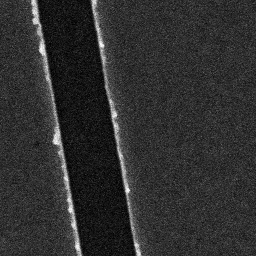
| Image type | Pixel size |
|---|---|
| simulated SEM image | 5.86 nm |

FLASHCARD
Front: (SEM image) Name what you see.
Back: one or a few lines or trenches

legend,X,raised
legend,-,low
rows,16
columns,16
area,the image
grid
XX----XXXXXXXXXX
XX----XXXXXXXXXX
XXX---XXXXXXXXXX
XXX---XXXXXXXXXX
XXX----XXXXXXXXX
XXX----XXXXXXXXX
XXX----XXXXXXXXX
XXXX---XXXXXXXXX
XXXX---XXXXXXXXX
XXXX---XXXXXXXXX
XXXX----XXXXXXXX
XXXX----XXXXXXXX
XXXX----XXXXXXXX
XXXXX---XXXXXXXX
XXXXX---XXXXXXXX
XXXXX---XXXXXXXX